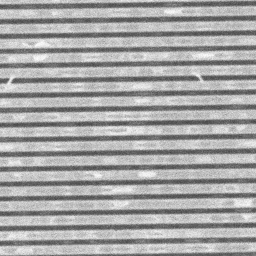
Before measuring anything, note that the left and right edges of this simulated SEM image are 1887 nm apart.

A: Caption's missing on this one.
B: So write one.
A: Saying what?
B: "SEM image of parallel lines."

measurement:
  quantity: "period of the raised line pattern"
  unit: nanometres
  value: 109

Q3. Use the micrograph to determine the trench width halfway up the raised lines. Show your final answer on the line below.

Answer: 6.38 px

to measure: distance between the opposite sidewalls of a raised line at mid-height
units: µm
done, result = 0.0673